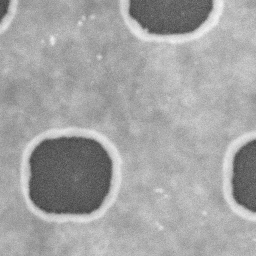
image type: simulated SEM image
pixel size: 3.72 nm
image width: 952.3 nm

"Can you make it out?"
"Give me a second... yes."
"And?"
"holes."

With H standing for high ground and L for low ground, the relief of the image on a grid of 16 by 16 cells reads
LHHHHHHHLLLLLHHH
HHHHHHHHLLLLLHHH
HHHHHHHHHHHHHHHH
HHHHHHHHHHHHHHHH
HHHHHHHHHHHHHHHH
HHHHHHHHHHHHHHHH
HHHHHHHHHHHHHHHH
HHHHHHHHHHHHHHHH
HHHLLLHHHHHHHHHH
HHLLLLLHHHHHHHHL
HHLLLLLHHHHHHHLL
HHLLLLLHHHHHHHLL
HHLLLLLHHHHHHHHL
HHHLLLHHHHHHHHHH
HHHHHHHHHHHHHHHH
HHHHHHHHHHHHHHHH